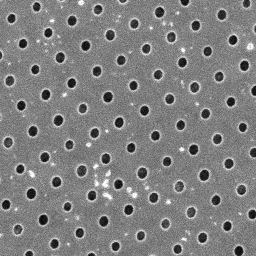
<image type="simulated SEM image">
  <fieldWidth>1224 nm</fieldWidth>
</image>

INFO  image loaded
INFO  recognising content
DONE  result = a regular array of holes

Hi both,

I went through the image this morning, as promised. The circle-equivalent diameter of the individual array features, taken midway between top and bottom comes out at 47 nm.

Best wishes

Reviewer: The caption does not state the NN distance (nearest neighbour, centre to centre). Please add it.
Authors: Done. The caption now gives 130 nanometres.